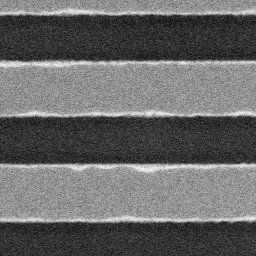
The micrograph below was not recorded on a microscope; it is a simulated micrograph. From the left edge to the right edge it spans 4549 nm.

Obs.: lines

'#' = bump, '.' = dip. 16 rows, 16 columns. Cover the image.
################
................
................
................
################
################
################
................
................
................
################
################
################
################
................
................